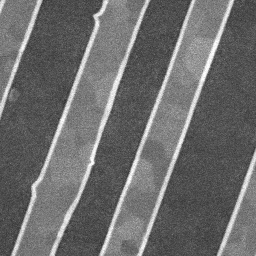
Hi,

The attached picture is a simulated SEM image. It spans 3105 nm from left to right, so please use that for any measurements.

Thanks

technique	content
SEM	one or a few lines or trenches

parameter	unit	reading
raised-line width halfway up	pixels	36.2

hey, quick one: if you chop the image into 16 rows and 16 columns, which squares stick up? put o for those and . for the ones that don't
oo....ooo...oo..
oo....ooo...oo..
oo....oo...ooo..
o....ooo...oo...
o....ooo...oo...
.....oo...oo....
....ooo...oo....
....ooo..ooo....
....oo...oo.....
...ooo...oo.....
...ooo..ooo.....
..ooo...oo.....o
..ooo...oo.....o
..oo...ooo.....o
.ooo...oo.....oo
.oo....oo.....oo